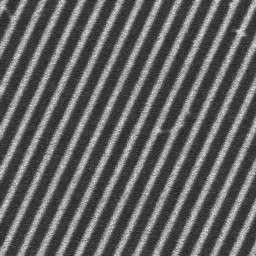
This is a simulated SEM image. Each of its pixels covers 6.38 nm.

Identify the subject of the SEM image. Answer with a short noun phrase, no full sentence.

parallel lines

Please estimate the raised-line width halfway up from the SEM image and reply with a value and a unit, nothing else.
37.6 nanometers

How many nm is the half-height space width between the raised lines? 75.1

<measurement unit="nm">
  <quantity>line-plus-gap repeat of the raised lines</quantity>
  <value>112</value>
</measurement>